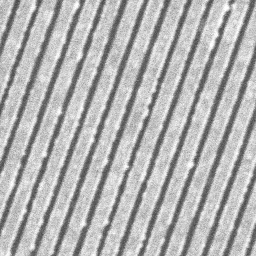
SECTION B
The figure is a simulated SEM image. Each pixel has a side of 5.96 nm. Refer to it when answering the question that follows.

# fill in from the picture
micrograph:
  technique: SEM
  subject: parallel lines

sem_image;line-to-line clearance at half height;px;6.95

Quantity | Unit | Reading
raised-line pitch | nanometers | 120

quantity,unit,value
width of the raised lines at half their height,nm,78.6